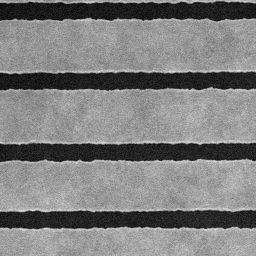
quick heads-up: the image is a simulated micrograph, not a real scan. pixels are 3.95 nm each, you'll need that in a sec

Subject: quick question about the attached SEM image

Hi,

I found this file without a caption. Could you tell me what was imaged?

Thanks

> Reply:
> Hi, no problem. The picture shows lines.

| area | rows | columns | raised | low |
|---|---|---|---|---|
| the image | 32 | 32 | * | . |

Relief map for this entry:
................................
................................
.**.***.*****.************..****
********************************
********************************
********************************
********************************
********************************
********************************
................................
................................
********************************
********************************
********************************
********************************
********************************
********************************
********************************
................................
................................
********************************
********************************
********************************
********************************
********************************
********************************
................................
................................
...............*.**..........*..
********************************
********************************
********************************